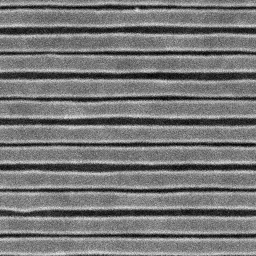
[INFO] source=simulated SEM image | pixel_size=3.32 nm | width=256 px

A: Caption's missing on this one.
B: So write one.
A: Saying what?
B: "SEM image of parallel lines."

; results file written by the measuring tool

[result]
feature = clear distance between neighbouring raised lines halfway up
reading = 22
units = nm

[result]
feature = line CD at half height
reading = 0.0502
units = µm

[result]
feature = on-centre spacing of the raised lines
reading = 75.9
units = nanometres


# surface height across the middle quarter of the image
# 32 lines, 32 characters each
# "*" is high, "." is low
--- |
********************************
********************************
................................
................................
********************************
********************************
********************************
*************************..*****
................................
.....................****.******
********************************
********************************
********************************
................................
................................
................................
********************************
********************************
********************************
.......**.......................
................................
********************************
********************************
********************************
............*******************.
................................
................................
*******...**********************
********************************
********************************
********************************
................................